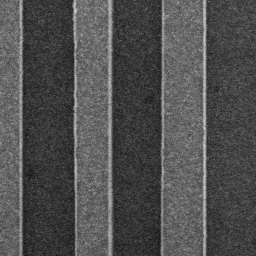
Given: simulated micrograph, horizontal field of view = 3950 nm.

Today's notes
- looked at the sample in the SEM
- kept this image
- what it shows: lines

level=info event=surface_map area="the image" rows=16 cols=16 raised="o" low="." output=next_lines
o....oo...ooo...
o....oo...ooo...
o....oo...ooo...
o....oo...ooo...
o....oo...ooo...
o....oo...ooo...
o....oo...ooo...
o....oo...ooo...
o....oo...ooo...
o....oo...ooo...
o....oo...ooo...
o....oo...ooo...
o....oo...ooo...
o....oo...ooo...
o....oo...ooo...
o....oo...ooo...